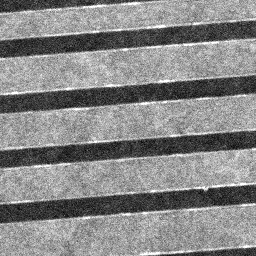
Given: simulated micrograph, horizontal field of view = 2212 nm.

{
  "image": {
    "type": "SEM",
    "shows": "parallel lines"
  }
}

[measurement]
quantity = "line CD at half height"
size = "183 nanometres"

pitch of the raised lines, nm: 470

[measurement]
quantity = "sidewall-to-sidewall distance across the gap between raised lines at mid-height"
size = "0.286 µm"